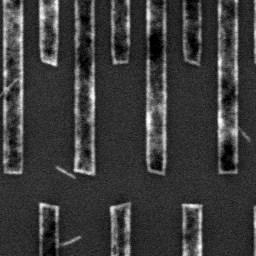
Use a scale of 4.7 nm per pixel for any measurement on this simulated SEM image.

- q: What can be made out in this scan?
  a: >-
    wiring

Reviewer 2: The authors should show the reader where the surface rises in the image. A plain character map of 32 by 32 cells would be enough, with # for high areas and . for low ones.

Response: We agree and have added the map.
.##..##...##..##...##..##..###..
.##..##...##..##...##..##..###..
.##..##...##..##...##..##..###..
.##..##...##..##...##..##..###..
.##..##...##..##...##..##..###..
.##..##...##..##...##..##..###..
.##..##...##..##...##..##..###..
.##...#...##..##...##...#..###..
.##.......##.......##......###..
.##.......##.......##......###..
.##.......##.......##......###..
###.......##.......##......###..
.##.......##.......##......###..
.##.......##.......##......###..
.##.......##.......##......###..
.##.......##.......##......###..
.##.......##.......##......###..
.##.......##.......##......###..
.##.......##.......##......###..
.##.......##.......##......###..
.##......###.......##......###..
...........#.......#............
................................
................................
................................
................................
.....##.......##.......##.......
.....##.......##.......##.......
.....##.......##.......##.......
.....##.......##.......##.......
.....##.......##.......##.......
.....##.......##.......##.......